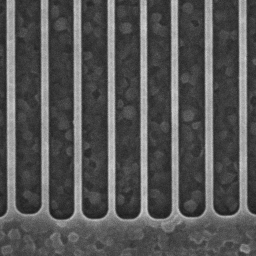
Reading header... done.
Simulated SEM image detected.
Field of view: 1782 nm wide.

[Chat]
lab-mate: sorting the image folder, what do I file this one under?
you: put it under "parallel lines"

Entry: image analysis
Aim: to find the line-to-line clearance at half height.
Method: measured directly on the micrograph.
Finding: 188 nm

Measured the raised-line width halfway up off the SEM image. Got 45.2 nm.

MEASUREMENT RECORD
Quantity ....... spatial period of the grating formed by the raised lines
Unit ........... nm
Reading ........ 230